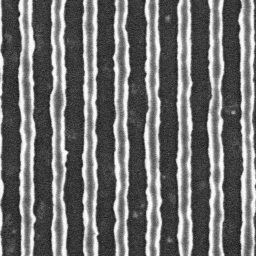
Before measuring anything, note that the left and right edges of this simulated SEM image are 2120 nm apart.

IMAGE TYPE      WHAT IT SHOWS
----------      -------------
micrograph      parallel lines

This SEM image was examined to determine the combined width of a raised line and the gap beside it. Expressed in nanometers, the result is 261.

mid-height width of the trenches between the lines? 20.4 px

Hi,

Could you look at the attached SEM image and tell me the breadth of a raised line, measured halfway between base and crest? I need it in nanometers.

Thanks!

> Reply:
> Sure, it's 87.9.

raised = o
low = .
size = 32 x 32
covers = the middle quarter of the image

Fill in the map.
.....ooo.....ooo.....ooo.....oo.
.....ooo.....ooo.....ooo.....oo.
.....ooo.....ooo.....oo......oo.
.....ooo.....ooo.....ooo.....oo.
.....ooo.....ooo.....ooo.....ooo
.....ooo.....ooo.....oo......ooo
.....ooo.....ooo.....oo......oo.
.....ooo.....ooo.....oo......oo.
.....ooo.....ooo.....ooo.....oo.
.....oo......ooo.....ooo.....oo.
.....ooo.....oo......ooo.....oo.
.....ooo.....ooo.....ooo.....oo.
.....ooo.....ooo.....ooo.....oo.
.....ooo.....oo......ooo.....oo.
.....ooo.....oo......ooo.....ooo
.....ooo.....oo.....oooo.....ooo
.....ooo.....ooo....oooo.....ooo
.....ooo.....ooo....ooo......ooo
.....ooo.....ooo....ooo......ooo
.....ooo.....ooo....oooo.....ooo
.....ooo.....ooo.....ooo.....oo.
.....ooo.....ooo.....ooo.....ooo
.....ooo.....ooo.....ooo.....ooo
.....ooo.....ooo.....ooo.....ooo
.....ooo.....ooo.....ooo....ooo.
.....ooo.....ooo.....ooo.....oo.
.....ooo.....ooo.....oo......ooo
.....ooo.....ooo.....oo......ooo
.....ooo.....ooo.....ooo.....oo.
.....ooo......oo.....ooo.....ooo
.....ooo......oo.....ooo.....ooo
.....ooo.....ooo.....ooo.....oo.